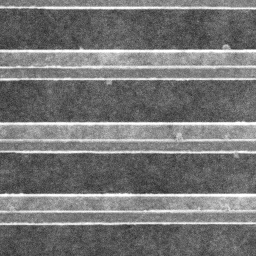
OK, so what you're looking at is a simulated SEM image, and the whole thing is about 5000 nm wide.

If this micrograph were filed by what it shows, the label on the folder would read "lines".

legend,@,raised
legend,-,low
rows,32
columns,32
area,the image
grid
@@@@@@@@@@@@@@@@@@@@@@@@@@@@@@@@
--------------------------------
--------------------------------
--------------------------------
--------------------------------
--------------------------------
@@@@@@@@@@@@@@@@@@@@@@@@@@@@@@@@
@@@@@@@@@@@@@@@@@@@@@@@@@@@@@@@@
@@@@@@@@@@@@@@@@@@@@@@@@@@@@@@@@
@@@@@@@@@@@@@@@@@@@@@@@@@@@@@@@@
--------------------------------
--------------------------------
--------------------------------
--------------------------------
--------------------------------
@@@@@@@@@@@@@@@@@@@@@@@@@@@@@@@@
@@@@@@@@@@@@@@@@@@@@@@@@@@@@@@@@
@@@@@@@@@@@@@@@@@@@@@@@@@@@@@@@@
@@@@@@@@@@@@@@@@@@@@@@@@@@@@@@@@
--------------------------------
--------------------------------
--------------------------------
--------------------------------
--------------------------------
@@@@@@@@@@@@@@@@@@@@@@@@@@@@@@@@
@@@@@@@@@@@@@@@@@@@@@@@@@@@@@@@@
@@@@@@@@@@@@@@@@@@@@@@@@@@@@@@@@
@@@@@@@@@@@@@@@@@@@@@@@@@@@@@@@@
--------------------------------
--------------------------------
--------------------------------
--------------------------------